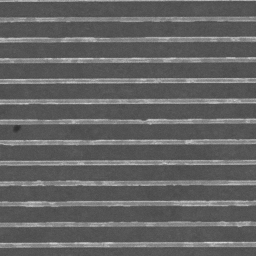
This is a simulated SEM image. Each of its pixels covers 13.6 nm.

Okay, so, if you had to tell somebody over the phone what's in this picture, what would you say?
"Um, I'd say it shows parallel lines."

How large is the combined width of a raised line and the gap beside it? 278 nm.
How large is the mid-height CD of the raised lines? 50.8 nm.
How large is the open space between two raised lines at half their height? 0.229 µm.